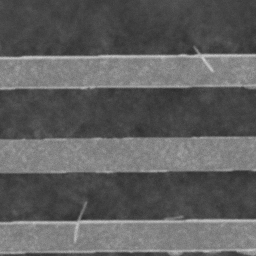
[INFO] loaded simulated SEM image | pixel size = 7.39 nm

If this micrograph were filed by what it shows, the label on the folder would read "lines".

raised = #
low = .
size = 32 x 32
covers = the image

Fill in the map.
................................
................................
................................
................................
................................
................................
................................
################################
################################
################################
################################
................................
................................
................................
................................
................................
................................
.....###########################
################################
################################
################################
#########...##..................
................................
................................
................................
................................
................................
................................
################################
################################
################################
############....................